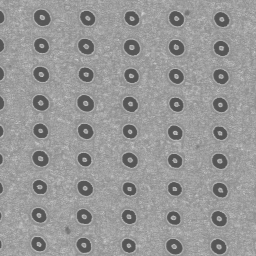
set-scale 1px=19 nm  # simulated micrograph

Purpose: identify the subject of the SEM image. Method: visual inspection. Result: a regular array of ring-shaped grooves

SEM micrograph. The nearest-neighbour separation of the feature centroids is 534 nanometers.